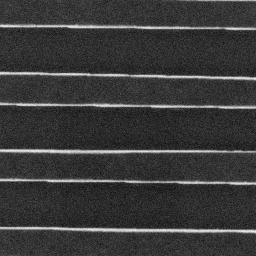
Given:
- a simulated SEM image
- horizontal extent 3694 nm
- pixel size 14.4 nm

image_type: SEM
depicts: lines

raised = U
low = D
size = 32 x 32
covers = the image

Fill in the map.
UUUUUUUUUUUUUUUUUUUUUUUUUUUUUUUU
UUUUUUUUUUUUUUUUUUUUUUUUUUUUUUUU
UUUUUUUUUUUUUUUUUUUUUUUUUUUUUUUU
DDDDDDDDDDDDDDDDDDUUUUUUUUUUUUUU
DDDDDDDDDDDDDDDDDDDDDDDDDDDDDDDD
DDDDDDDDDDDDDDDDDDDDDDDDDDDDDDDD
DDDDDDDDDDDDDDDDDDDDDDDDDDDDDDDD
DDDDDDDDDDDDDDDDDDDDDDDDDDDDDDDD
DDDDDDDDDDDDDDDDDDDDDDDDDDDDDDDD
UUUUUUUUUUUUUUUUUUUDDDDDDDDDDDDD
UUUUUUUUUUUUUUUUUUUUUUUUUUUUUUUU
UUUUUUUUUUUUUUUUUUUUUUUUUUUUUUUU
UUUUUUUUUUUUUUUUUUUUUUUUUUUUUUUU
DDDDDDDDDDDDDDDDDDDDDDDDDDDDDDDD
DDDDDDDDDDDDDDDDDDDDDDDDDDDDDDDD
DDDDDDDDDDDDDDDDDDDDDDDDDDDDDDDD
DDDDDDDDDDDDDDDDDDDDDDDDDDDDDDDD
DDDDDDDDDDDDDDDDDDDDDDDDDDDDDDDD
DDDDDDDDDDDDDDDDDDDDDDDDDDDDDDDD
UUUUUUUUUUUUUUUUUUUUUUUUUUUUUUUU
UUUUUUUUUUUUUUUUUUUUUUUUUUUUUUUU
UUUUUUUUUUUUUUUUUUUUUUUUUUUUUUUU
UUUUUUUUUUUUUUUUUUUUUUUUUUUUUUUU
DDDDDDDDDDDDDDDDDDDDDDDDDDDDDDDD
DDDDDDDDDDDDDDDDDDDDDDDDDDDDDDDD
DDDDDDDDDDDDDDDDDDDDDDDDDDDDDDDD
DDDDDDDDDDDDDDDDDDDDDDDDDDDDDDDD
DDDDDDDDDDDDDDDDDDDDDDDDDDDDDDDD
DDDDDDDDDDDDDDDDDDDDDDDDDDDDDDDD
UUUUUUUUUUUUUUUUUUUUUUUUUUUUUUUU
UUUUUUUUUUUUUUUUUUUUUUUUUUUUUUUU
UUUUUUUUUUUUUUUUUUUUUUUUUUUUUUUU